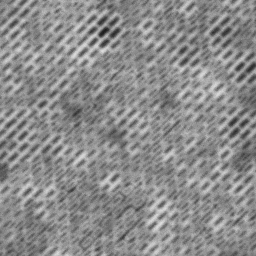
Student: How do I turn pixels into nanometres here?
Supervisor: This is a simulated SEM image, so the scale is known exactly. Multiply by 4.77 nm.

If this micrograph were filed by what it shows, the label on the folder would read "a regular array of holes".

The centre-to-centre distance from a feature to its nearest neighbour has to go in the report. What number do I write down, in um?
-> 0.0505